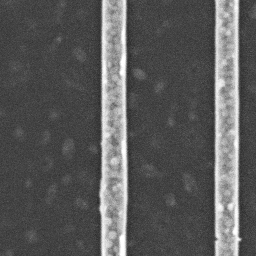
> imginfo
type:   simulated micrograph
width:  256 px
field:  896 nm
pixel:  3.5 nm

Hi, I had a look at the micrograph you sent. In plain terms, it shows one or a few lines or trenches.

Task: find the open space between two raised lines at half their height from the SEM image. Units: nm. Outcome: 318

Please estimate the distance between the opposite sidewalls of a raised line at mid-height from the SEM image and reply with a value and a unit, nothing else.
76.1 nm